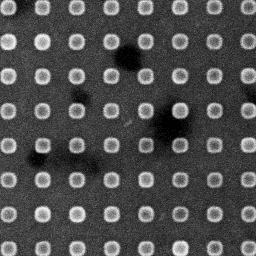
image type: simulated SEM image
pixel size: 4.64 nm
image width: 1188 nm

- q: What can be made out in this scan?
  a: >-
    a regular array of raised bodies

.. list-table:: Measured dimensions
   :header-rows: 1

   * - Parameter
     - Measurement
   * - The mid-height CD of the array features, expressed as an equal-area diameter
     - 70.5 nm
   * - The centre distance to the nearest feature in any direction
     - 158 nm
